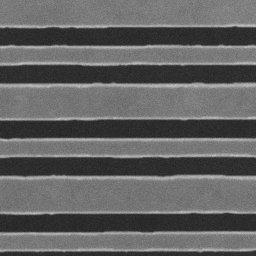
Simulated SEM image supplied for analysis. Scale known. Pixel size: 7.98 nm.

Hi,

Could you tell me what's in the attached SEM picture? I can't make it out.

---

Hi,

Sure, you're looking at lines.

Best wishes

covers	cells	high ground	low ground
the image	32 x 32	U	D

UUUUUUUUUUUUUUUUUUUUUUUUUUUUUUUU
UUUUUUUUUUUUUUUUUUUUUUUUUUUUUUUU
UUUUUUUUUUUUUUUUUUUUUUUUUUUUUUUU
DDDDDDDDDDDDDDDDDDDDDDDDDDDDDDDD
DDDDDDDDDDDDDDDDDDDDDDDDDDDDDDDD
DDDDDDDDDDDDDDDDDDDDDDDDDDDDDDDD
UUUUUUUUUUUUUUUUUUUUUUUUUUUUUUUU
UUUUUUUUUUUUUUUUUUUUUUUUUUUUUUUU
DDDDDDDDDDDDDDDDDDDDDDDDDDDDDDDD
DDDDDDDDDDDDDDDDDDDDDDDDDDDDDDDD
DDDDDDDDDDDDDDDDDDDDDDDDDDDDDDUU
UUUUUUUUUUUUUUUUUUUUUUUUUUUUUUUU
UUUUUUUUUUUUUUUUUUUUUUUUUUUUUUUU
UUUUUUUUUUUUUUUUUUUUUUUUUUUUUUUU
UUUUUUUUUUUUUUUUUUUUUUUUUUUUUUUU
DDDDDDDDDDDDDDDDDDDDDDDDDDDDDDDD
DDDDDDDDDDDDDDDDDDDDDDDDDDDDDDDD
UUUUUUUUUUUUUUUUUUUUUUUUUUUUUUUU
UUUUUUUUUUUUUUUUUUUUUUUUUUUUUUUU
UUUUUUUUUUUUUUUUUUUUUUUUUUDDDUUU
DDDDDDDDDDDDDDDDDDDDDDDDDDDDDDDD
DDDDDDDDDDDDDDDDDDDDDDDDDDDDDDDD
UUUUUUUUUUUUUUUUUUUUUUUUUUUUUUUU
UUUUUUUUUUUUUUUUUUUUUUUUUUUUUUUU
UUUUUUUUUUUUUUUUUUUUUUUUUUUUUUUU
UUUUUUUUUUUUUUUUUUUUUUUUUUUUUUUU
UUUUUUUUUUUUUUUUUUUUUUUUUUUUUUUU
DDDDDDDDDDDDDDDDDDDDDDDDDDDDDDDD
DDDDDDDDDDDDDDDDDDDDDDDDDDDDDDDD
UUUUUUUUUUUUUUUUUUUUUUUUUUUUUUUU
UUUUUUUUUUUUUUUUUUUUUUUUUUUUUUUU
DDDDDDDDDDDDDDDDDDDDDDDDDDDDDDDD